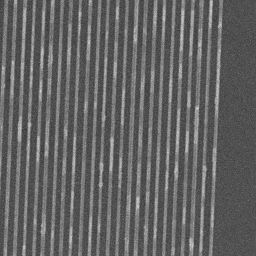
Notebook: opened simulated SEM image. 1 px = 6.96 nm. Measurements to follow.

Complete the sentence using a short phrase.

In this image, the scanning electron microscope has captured parallel lines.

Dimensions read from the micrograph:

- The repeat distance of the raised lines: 65 nanometres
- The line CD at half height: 15.7 nm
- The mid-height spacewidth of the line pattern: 47 nanometers